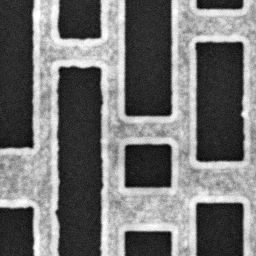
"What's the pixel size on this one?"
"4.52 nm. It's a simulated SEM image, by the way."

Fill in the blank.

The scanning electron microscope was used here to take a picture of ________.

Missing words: one or a few lines or trenches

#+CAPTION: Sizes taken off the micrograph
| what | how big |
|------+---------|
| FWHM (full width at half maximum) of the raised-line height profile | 18.6 px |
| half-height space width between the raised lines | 0.236 um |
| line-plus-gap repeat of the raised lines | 312 nanometres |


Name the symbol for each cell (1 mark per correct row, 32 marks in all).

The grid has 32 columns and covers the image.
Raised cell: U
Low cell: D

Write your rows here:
DDDDDUUDDDDDDUUDDDDDDDUUDDDDDDDU
DDDDDUUDDDDDDUUDDDDDDDUUUDDDDDUU
DDDDDUUDDDDDDUUDDDDDDDUUUUUUUUUU
DDDDUUUDDDDDDUUDDDDDDDUUUUUUUUUU
DDDDDUUDDDDDDUUDDDDDDDUUUUUUUUUU
DDDDDUUUUUUUUUUDDDDDDDUUDDDDDDDU
DDDDDUUUUUUUUUUDDDDDDDUUDDDDDDDU
DDDDDUUUUUUUUUUDDDDDDDUUDDDDDDDU
DDDDDUUDDDDDDUUDDDDDDDUUDDDDDDDU
DDDDDUUDDDDDDUUDDDDDDDUUDDDDDDDU
DDDDUUUDDDDDDUUDDDDDDDUUDDDDDDDU
DDDDDUUDDDDDDUUDDDDDDDUUDDDDDDDU
DDDDUUUDDDDDDUUDDDDDDDUUDDDDDDDU
DDDDUUUDDDDDDUUDDDDDDDUUDDDDDDDU
DDDDDUUDDDDDDUUDDDDDDDUUDDDDDDDU
DDDDUUUDDDDDDUUUUUUUUUUUDDDDDDDU
DDDDUUUDDDDDDUUUUUUUUUUUDDDDDDDU
DDDDUUUDDDDDDUUUUUUUUUUUDDDDDDDU
DDDDUUUDDDDDDUUDDDDDDDUUDDDDDDDU
UUUUUUUDDDDDDUUDDDDDDDUUDDDDDDDU
UUUUUUUDDDDDDUUDDDDDDDUUUDDDDDUU
UUUUUUUDDDDDDUUDDDDDDDUUUUUUUUUU
UUUUUUUDDDDDDUUDDDDDDDUUUUUUUUUU
UUUUUUUDDDDDDUUDDDDDDDUUUUUUUUUU
UUUUUUUDDDDDDUUUUUUUUUUUUUUUUUUU
DDUUUUUDDDDDDUUUUUUUUUUUDDDDDDDU
DDDDDUUDDDDDDUUUUUUUUUUUDDDDDDDU
DDDDDUUDDDDDDUUUUUUUUUUUDDDDDDDU
DDDDUUUDDDDDDUUUDDDDDUUUDDDDDDDU
DDDDDUUDDDDDDUUDDDDDDDUUDDDDDDDU
DDDDDUUDDDDDDUUDDDDDDDUUDDDDDDDU
DDDDDUUDDDDDDUUDDDDDDDUUDDDDDDDU